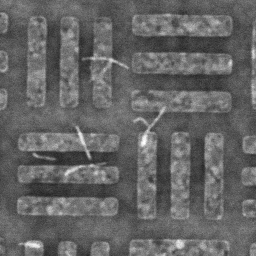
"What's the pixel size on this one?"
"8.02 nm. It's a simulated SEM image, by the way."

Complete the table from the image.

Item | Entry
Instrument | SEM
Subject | groups of lines, slits or small figures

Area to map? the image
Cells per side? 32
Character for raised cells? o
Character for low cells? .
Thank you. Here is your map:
................................
................................
o...oo..oo..oo...oooooooooooo...
o...oo..oo..oo...oooooooooooo...
....oo..oo..oo..................
....oo..oo..oo..................
....oo..oo..oo..................
o..ooo..oo..oo...oooooooooooo...
o...oo..oo..oo...oooooooooooo...
...ooo..oo..oo..................
...ooo..oo..oo..................
o..ooo..oo..oo...ooo............
o..oo...oo..oo...oooooooooooo...
.................oooooooooooo...
................................
................................
..................o.............
..ooooooooooooo..ooo..oo..oo..oo
..ooooooooooooo..oo..ooo..oo..oo
.................oo..ooo..oo....
.................oo..ooo..oo....
..ooooooooooooo..oo..ooo..oo..oo
..ooooooooooooo..oo..ooo..oo..oo
.................oo..ooo..oo....
.................oo..ooo..oo....
..ooooooooooooo..oo..ooo..oo..oo
..ooooooooooooo..oo..ooo..oo..oo
................................
................................
................................
...oo...o...o...oooooooooooo....
...oo..oo..ooo..ooooooooooooo..o